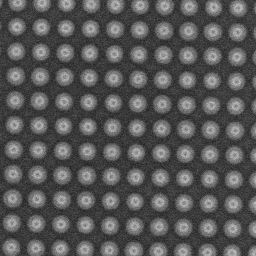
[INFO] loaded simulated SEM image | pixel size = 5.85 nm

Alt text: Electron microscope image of an array of small figures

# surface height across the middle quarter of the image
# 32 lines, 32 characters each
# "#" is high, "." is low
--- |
................................
#.....#.....#...................
##..####...###...###...###...###
##..####..#####..####..####..###
##..####...###..#####..####..###
......#....###...###...###...###
................................
#...............................
##..####...###...###...###...###
##..####..####..#####.#####..###
##..####..####..#####.#####..###
.....##....###...###...###...###
................................
................................
##..####...###...###...###...###
##..####..####..####..#####.####
##..####..####..####..#####.####
#....##....###...###...###...###
................................
................................
#...###....###...##....##....##.
##..####..####..####..####..####
##..####..####..####..####..####
#...###...####..####..####..####
..............................#.
................................
#...###...###....##....##.......
##..####..####..####..####..####
##..####..####..####..####..####
#...###...####..####..####..####
.......................##....##.
................................